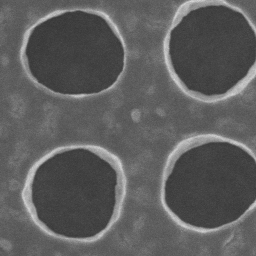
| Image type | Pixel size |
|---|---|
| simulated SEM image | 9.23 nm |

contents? holes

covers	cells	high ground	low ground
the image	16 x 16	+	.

++++++++++++...+
++.....++++.....
++......+++.....
+.......+++.....
++......+++.....
+++....+++++...+
++++++++++++++++
++++++++++++++++
++++++++++++++++
++++..+++++.....
++.....+++......
++......++......
++......++......
++.....++++....+
+++...++++++++++
++++++++++++++++